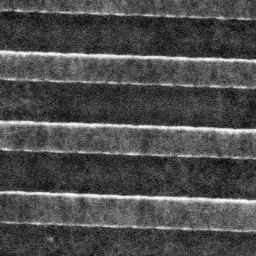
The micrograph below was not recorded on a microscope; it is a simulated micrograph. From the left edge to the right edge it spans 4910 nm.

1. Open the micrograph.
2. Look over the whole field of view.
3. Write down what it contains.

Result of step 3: lines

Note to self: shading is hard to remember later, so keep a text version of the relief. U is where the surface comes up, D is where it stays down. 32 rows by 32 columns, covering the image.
UUUUUUUUUUUUUUUUUUUUUUUUUUUUUUUU
DDDDDDDUUUUUUUUUUUUUUUUUUUUUUUUU
DDDDDDDDDDDDDDDDDDDDDDDDDDDDDDDD
DDDDDDDDDDDDDDDDDDDDDDDDDDDDDDDD
DDDDDDDDDDDDDDDDDDDDDDDDDDDDDDDD
DDDDDDDDDDDDDDDDDDDDDDDDDDDDDDDD
UDDDDDDDDDDDDDDDDDDDDDDDDDDDDDDD
UUUUUUUUUUUUUUUUUUUUUUUUUUUUUUDD
UUUUUUUUUUUUUUUUUUUUUUUUUUUUUUUU
UUUUUUUUUUUUUUUUUUUUUUUUUUUUUUUU
DDDDDDDDDDDDDDDDDDDDUUUUUUUUUUUU
DDDDDDDDDDDDDDDDDDDDDDDDDDDDDDDD
DDDDDDDDDDDDDDDDDDDDDDDDDDDDDDDD
DDDDDDDDDDDDDDDDDDDDDDDDDDDDDDDD
DDDDDDDDDDDDDDDDDDDDDDDDDDDDDDDD
UUUUUUUUUDDDDDDDDDDDDDDDDDDDDDDD
UUUUUUUUUUUUUUUUUUUUUUUUUUUUUUUU
UUUUUUUUUUUUUUUUUUUUUUUUUUUUUUUU
UUUUUUUUUUUUUUUUUUUUUUUUUUUUUUUU
DDDDDDDDDDDDDDDDDDDDDDDDDDUUUUUU
DDDDDDDDDDDDDDDDDDDDDDDDDDDDDDDD
DDDDDDDDDDDDDDDDDDDDDDDDDDDDDDDD
DDDDDDDDDDDDDDDDDDDDDDDDDDDDDDDD
DDDDDDDDDDDDDDDDDDDDDDDDDDDDDDDD
UUUUUUUUUUUUUUDDDDDDDDDDDDDDDDDD
UUUUUUUUUUUUUUUUUUUUUUUUUUUUUUUU
UUUUUUUUUUUUUUUUUUUUUUUUUUUUUUUU
UUUUUUUUUUUUUUUUUUUUUUUUUUUUUUUU
DDDDDDDDDDDDDDDDDDDUUUUUUUUUUUUU
DDDDDDDDDDDDDDDDDDDDDDDDDDDDDDDD
DDDDDDDDDDDDDDDDDDDDDDDDDDDDDDDD
DDDDDDDDDDDDDDDDDDDDDDDDDDDDDDDD